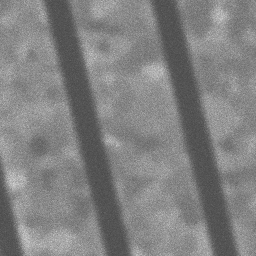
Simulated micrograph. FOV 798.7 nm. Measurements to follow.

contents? one or a few lines or trenches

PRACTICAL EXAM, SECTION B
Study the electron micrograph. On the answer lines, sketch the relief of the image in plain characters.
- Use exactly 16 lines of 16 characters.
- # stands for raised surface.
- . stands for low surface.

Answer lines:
###..####..#####
###..#####..####
###..#####..####
###..#####..####
####..####..####
####..#####..###
####..#####..###
####..#####..###
#####..####..###
#####..#####.###
#####..#####..##
#####..#####..##
.#####..####..##
.#####..#####.##
.#####..#####..#
.#####..#####..#